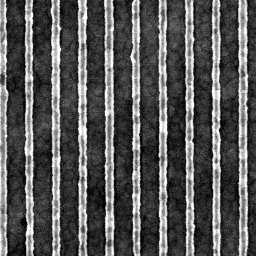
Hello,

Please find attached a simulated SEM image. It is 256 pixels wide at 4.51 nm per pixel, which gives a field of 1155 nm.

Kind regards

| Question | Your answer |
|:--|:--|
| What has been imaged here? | parallel lines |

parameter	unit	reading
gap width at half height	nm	93.6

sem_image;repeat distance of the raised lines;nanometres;120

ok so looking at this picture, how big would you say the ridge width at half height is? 5.63 px